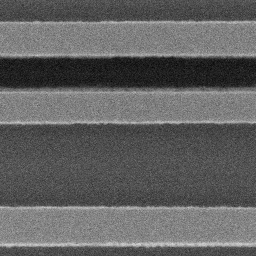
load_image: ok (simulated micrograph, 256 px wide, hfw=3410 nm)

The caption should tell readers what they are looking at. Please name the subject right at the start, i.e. lines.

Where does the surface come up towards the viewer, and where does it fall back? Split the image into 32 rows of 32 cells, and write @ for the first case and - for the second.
--------------------------------
--------------------------------
--------------------------------
@@@@@@@@@@@@@@@@@@@@@@@@@@@@@@@@
@@@@@@@@@@@@@@@@@@@@@@@@@@@@@@@@
@@@@@@@@@@@@@@@@@@@@@@@@@@@@@@@@
@@@@@@@@@@@@@@@@@@@@@@@@@@@@@@@@
--------------------------------
--------------------------------
--------------------------------
--------------------------------
-----@--@@@@@@@@@@@@@@@@@@@@@@@@
@@@@@@@@@@@@@@@@@@@@@@@@@@@@@@@@
@@@@@@@@@@@@@@@@@@@@@@@@@@@@@@@@
@@@@@@@@@@@@@@@@@@@@@@@@@@@@@@@@
--------------------------------
--------------------------------
--------------------------------
--------------------------------
--------------------------------
--------------------------------
--------------------------------
--------------------------------
--------------------------------
--------------------------------
--------------------------------
@@@@@@@@@@@@@@@@@@@@@@@@@@@@@@@@
@@@@@@@@@@@@@@@@@@@@@@@@@@@@@@@@
@@@@@@@@@@@@@@@@@@@@@@@@@@@@@@@@
@@@@@@@@@@@@@@@@@@@@@@@@@@@@@@@@
@@@@@@@@@@--@@@@@@@@@@@@--@----@
--------------------------------